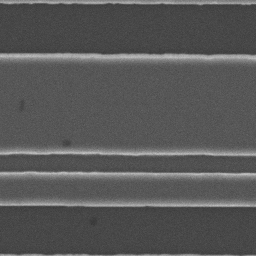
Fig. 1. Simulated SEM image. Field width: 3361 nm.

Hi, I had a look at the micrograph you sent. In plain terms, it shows lines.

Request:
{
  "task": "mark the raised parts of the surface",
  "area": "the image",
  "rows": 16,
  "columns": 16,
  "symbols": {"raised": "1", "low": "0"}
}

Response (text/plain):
0000000000000000
0000000000000000
0000000000000000
1111110010100000
1111111111111111
1111111111111111
1111111111111111
1111111111111111
1111111111111111
1111111111111111
1111111111111111
1111111111111111
1111111111111111
0000000000000000
0000000000000000
0000000000000000